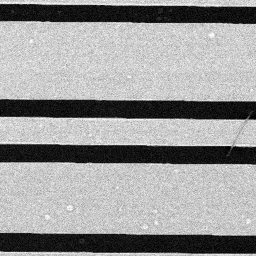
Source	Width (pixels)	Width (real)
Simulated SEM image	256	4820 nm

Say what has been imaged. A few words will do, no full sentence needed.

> lines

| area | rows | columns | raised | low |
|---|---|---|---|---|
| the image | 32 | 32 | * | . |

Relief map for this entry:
.....***************************
................................
................................
********************************
********************************
********************************
********************************
********************************
********************************
********************************
********************************
********************************
.......................*********
................................
................................
********************************
********************************
********************************
................................
................................
**********************..........
********************************
********************************
********************************
********************************
********************************
********************************
********************************
********************************
................................
................................
................................